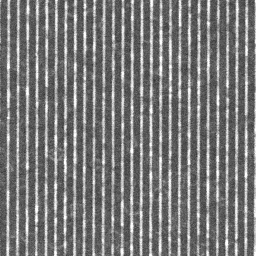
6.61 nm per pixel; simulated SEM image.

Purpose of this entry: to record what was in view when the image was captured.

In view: parallel lines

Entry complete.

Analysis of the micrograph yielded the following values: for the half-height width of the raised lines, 0.0132 µm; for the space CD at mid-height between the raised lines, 49.5 nanometres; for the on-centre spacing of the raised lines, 9.52 pixels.